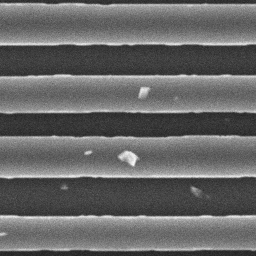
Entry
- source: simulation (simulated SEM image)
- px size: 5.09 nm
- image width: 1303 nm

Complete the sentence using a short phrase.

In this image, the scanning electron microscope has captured lines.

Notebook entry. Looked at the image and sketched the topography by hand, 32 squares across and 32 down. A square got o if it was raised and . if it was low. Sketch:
oooooo.oooo.....................
oooooooooooooooooooooooooooooooo
oooooooooooooooooooooooooooooooo
oooooooooooooooooooooooooooooooo
oooooooooooooooooooooooooooooooo
oooooooo.oo..ooo....ooo..oooooo.
................................
................................
................................
.......oo.............o....oo...
oooooooooooooooooooooooooooooooo
oooooooooooooooooooooooooooooooo
oooooooooooooooooooooooooooooooo
oooooooooooooooooooooooooooooooo
................................
................................
................................
oooooooooooooooooooooooooooooooo
oooooooooooooooooooooooooooooooo
oooooooooooooooooooooooooooooooo
oooooooooooooooooooooooooooooooo
oooooooooooooooooooooooooooooooo
................................
................................
................................
................................
................................
oooooooooooooooooooooooooooooooo
oooooooooooooooooooooooooooooooo
oooooooooooooooooooooooooooooooo
oooooooooooooooooooooooooooooooo
................................